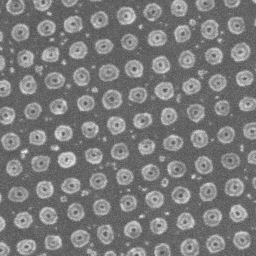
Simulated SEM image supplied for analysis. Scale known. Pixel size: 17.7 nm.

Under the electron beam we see a regular array of ring-shaped raised bodies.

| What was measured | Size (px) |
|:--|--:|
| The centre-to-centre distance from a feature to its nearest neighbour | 26.1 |